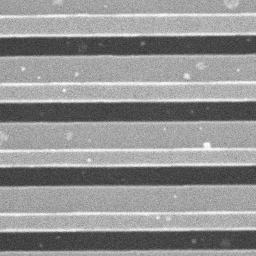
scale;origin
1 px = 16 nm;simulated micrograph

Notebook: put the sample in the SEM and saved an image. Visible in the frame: lines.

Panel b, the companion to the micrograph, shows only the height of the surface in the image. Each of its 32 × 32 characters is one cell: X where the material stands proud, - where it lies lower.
XXXXXXXXXXXXXXXXXXXXXXXXXXXXXXXX
XXXXXXXXXXXXXXXXXXXXXXXXXXXXXXXX
XXXXXXXXXXXXXXXXXXXXXXXXXXXXXXXX
XXXXXXXXXXXXXXXXXXXXXXXXXXXXXXXX
XXXX----------------------------
--------------------------------
--------------------------------
XXXXXXXXXXXXXXXXXXXXXXXXXXXXXXXX
XXXXXXXXXXXXXXXXXXXXXXXXXXXXXXXX
XXXXXXXXXXXXXXXXXXXXXXXXXXXXXXXX
XXXXXXXXXXXXXXXXXXXXXXXXXXXXXXXX
XXXXXXXXXXXXXXXXXXXXXXXXXXXXXXXX
XXXXXXXXXXXXXXXXXXXXXXXXXXXXXXX-
--------------------------------
--------------------------------
XXXXXXXXXXXXXXXXXXXXXXXXXXXXXXXX
XXXXXXXXXXXXXXXXXXXXXXXXXXXXXXXX
XXXXXXXXXXXXXXXXXXXXXXXXXXXXXXXX
XXXXXXXXXXXXXXXXXXXXXXXXXXXXXXXX
XXXXXXXXXXXXXXXXXXXXXXXXXXXXXXXX
XXXXXXXXXXXXXXXXXXXXXXXXXXXXXXXX
--------------------------------
--------------------------------
XXXXXXXXXXXXXXXXXXXXXXXXXXXXXXXX
XXXXXXXXXXXXXXXXXXXXXXXXXXXXXXXX
XXXXXXXXXXXXXXXXXXXXXXXXXXXXXXXX
XXXXXXXXXXXXXXXXXXXXXXXXXXXXXXXX
XXXXXXXXXXXXXXXXXXXXXXXXXXXXXXXX
XXXXXXXXXXXXXXXXXXXXXXXXXXXXXXXX
--------------------------------
--------------------------------
----------------XXXXXXXXXXXXXXXX